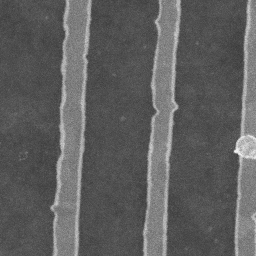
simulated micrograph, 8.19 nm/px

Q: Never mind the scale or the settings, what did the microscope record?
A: one or a few lines or trenches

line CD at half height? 0.162 um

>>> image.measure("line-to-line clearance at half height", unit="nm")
576